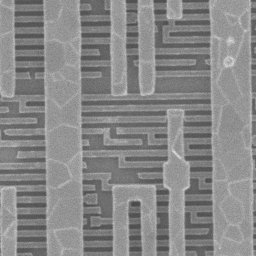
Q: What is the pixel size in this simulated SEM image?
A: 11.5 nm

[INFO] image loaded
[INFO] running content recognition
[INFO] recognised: wiring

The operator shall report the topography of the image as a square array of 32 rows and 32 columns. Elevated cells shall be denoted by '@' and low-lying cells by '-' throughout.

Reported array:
@@----@@@@----@@-@@--@@---@@@@@-
@@----@@@@----@@-@@--@@---@@@@@-
@@----@@@@----@@-@@-------@@@@@-
@@----@@@@----@@-@@-------@@@@@-
@@----@@@@----@@-@@-------@@@@@-
@@----@@@@----@@-@@-------@@@@@-
@@----@@@@----@@-@@-------@@@@@-
@@----@@@@----@@-@@-------@@@@@-
@@----@@@@----@@--@-------@@@@@-
@@----@@@@----@@--@-------@@@@@-
@@----@@@@----@@--@-------@@@@@-
@@----@@@@----@@--@-------@@@@@-
------@@@@----------------@@@@@-
------@@@@----------------@@@@@-
------@@@@-----------@@----@@@@-
------@@@@-----------@@----@@@@-
------@@@@-----------@@----@@@@-
------@@@@-----------@@----@@@@-
------@@@@-----------@@----@@@@-
------@@@@-----------@@----@@@@@
------@@@@-----------@@----@@@@@
------@@@@----------@@@@---@@@@@
------@@@@----------@@@@---@@@@@
-@----@@@@----@@@@@--@@----@@@@@
@@----@@@@----@@@@@--@@----@@@@@
@@----@@@@----@@-@@--@@----@@@@@
@@----@@@@----@@--@--@@----@@@@@
@@----@@@@----@@--@--@@----@@@@@
@@----@@@@----@@--@--@@----@@@@@
@@----@@@@----@@--@--@@----@@@@@
@@----@@@@----@@--@--@@----@@@@@
@@----@@@@----@@--@--@@----@@@@@